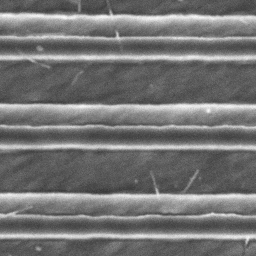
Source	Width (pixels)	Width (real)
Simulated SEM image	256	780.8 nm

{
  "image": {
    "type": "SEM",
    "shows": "lines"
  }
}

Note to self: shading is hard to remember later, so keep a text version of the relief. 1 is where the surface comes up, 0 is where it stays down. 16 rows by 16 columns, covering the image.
0000000000000000
1111111111111111
1111111111111111
1111111111111111
0000000000000000
0000000000000000
0000000000000000
1111111111111111
1111111111111111
0000000000000000
0000000000000000
0000000000000000
1111111111111111
1111111111111111
1111111111111111
0000000000000000